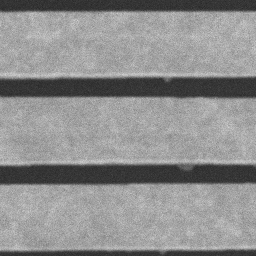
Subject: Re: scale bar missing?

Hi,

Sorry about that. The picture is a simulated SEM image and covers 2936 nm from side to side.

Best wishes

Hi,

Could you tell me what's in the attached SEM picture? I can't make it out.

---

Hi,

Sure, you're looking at lines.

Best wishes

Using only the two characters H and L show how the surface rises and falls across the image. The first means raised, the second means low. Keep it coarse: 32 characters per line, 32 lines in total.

LLLLLLLLLLLLLLLLLLLLLLLLLLLLLLLL
LLLLLLLLLLLLLLLLLLLLLLLLLLLLLLLL
HHHHHHHHHHHHHHHHHHHHHHHHHHHHHHHH
HHHHHHHHHHHHHHHHHHHHHHHHHHHHHHHH
HHHHHHHHHHHHHHHHHHHHHHHHHHHHHHHH
HHHHHHHHHHHHHHHHHHHHHHHHHHHHHHHH
HHHHHHHHHHHHHHHHHHHHHHHHHHHHHHHH
HHHHHHHHHHHHHHHHHHHHHHHHHHHHHHHH
HHHHHHHHHHHHHHHHHHHHHHHHHHHHHHHH
HHHHHHHHHHHHHHHHHHHHHHHHHHHHHHHH
LLLLLLLLLLLLLLLLLLLLLLLLLLLLLLLL
LLLLLLLLLLLLLLLLLLLLLLLLLLLLLLLL
HHHHHHHHHHHHHHHHHHHHHHHHHHHHHHHH
HHHHHHHHHHHHHHHHHHHHHHHHHHHHHHHH
HHHHHHHHHHHHHHHHHHHHHHHHHHHHHHHH
HHHHHHHHHHHHHHHHHHHHHHHHHHHHHHHH
HHHHHHHHHHHHHHHHHHHHHHHHHHHHHHHH
HHHHHHHHHHHHHHHHHHHHHHHHHHHHHHHH
HHHHHHHHHHHHHHHHHHHHHHHHHHHHHHHH
HHHHHHHHHHHHHHHHHHHHHHHHHHHHHHHH
HHHHHLHHHHHHHLLLLLLLLLLLLLLLLLLL
LLLLLLLLLLLLLLLLLLLLLLLLLLLLLLLL
LLLLLLLLLLLLLLLLLLLLLLLLLLLLLLLL
HHHHHHHHHHHHHHHHHHHHHHHHHHHHHHHH
HHHHHHHHHHHHHHHHHHHHHHHHHHHHHHHH
HHHHHHHHHHHHHHHHHHHHHHHHHHHHHHHH
HHHHHHHHHHHHHHHHHHHHHHHHHHHHHHHH
HHHHHHHHHHHHHHHHHHHHHHHHHHHHHHHH
HHHHHHHHHHHHHHHHHHHHHHHHHHHHHHHH
HHHHHHHHHHHHHHHHHHHHHHHHHHHHHHHH
HHHHHHHHHHHHHHHHHHHHHHHHHHHHHHHH
LLLLLLLLLLLLLLLLLLLLLLLLLLLLLLLL